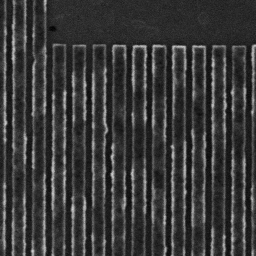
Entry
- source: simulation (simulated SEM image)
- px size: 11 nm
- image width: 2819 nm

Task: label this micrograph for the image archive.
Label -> parallel lines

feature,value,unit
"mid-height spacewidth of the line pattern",75.7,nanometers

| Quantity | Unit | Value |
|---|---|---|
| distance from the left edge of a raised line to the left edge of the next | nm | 219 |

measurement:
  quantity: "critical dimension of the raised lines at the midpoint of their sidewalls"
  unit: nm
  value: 144